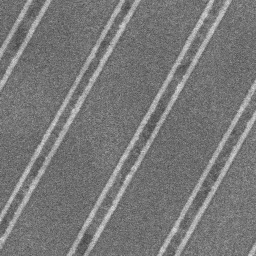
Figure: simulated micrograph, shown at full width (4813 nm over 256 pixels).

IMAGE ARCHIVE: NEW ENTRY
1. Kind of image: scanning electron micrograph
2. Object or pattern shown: one or a few lines or trenches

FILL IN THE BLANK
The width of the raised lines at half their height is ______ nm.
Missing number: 281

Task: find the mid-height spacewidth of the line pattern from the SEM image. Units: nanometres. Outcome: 1200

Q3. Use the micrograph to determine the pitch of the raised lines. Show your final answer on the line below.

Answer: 1490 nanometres